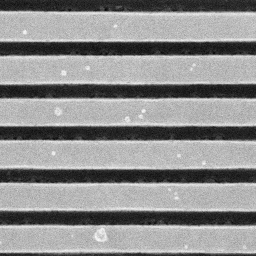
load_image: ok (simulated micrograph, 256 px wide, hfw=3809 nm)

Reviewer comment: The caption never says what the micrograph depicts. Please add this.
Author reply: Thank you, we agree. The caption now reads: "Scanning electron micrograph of lines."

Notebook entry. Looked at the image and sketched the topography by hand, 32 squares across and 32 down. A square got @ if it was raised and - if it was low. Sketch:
--------------------------------
--------------------------------
@@@@@@@@@@@@@@@@@@@@@@@@@@@@@@@@
@@@@@@@@@@@@@@@@@@@@@@@@@@@@@@@@
@@@@@@@@@@@@@@@@@@@@@@@@@@@@@@@@
--------------------------------
--------------------------------
@@@@@@@@@@@@@@@@@@@@@@@@@@@@@@@@
@@@@@@@@@@@@@@@@@@@@@@@@@@@@@@@@
@@@@@@@@@@@@@@@@@@@@@@@@@@@@@@@@
@@@-------------@@--------------
--------------------------------
@@@@@@@@@@@@@@@@@@@@@@@@@@@@@@@@
@@@@@@@@@@@@@@@@@@@@@@@@@@@@@@@@
@@@@@@@@@@@@@@@@@@@@@@@@@@@@@@@@
@@@@@@@@@@@@@@@@@@@@@@@@@@@@@@@@
--------------------------------
--------------------------------
@@@@@@@@@@@@@@@@@@@@@@@@@@@@@@@@
@@@@@@@@@@@@@@@@@@@@@@@@@@@@@@@@
@@@@@@@@@@@@@@@@@@@@@@@@@@@@@@@@
--------------------------------
--------------------------------
@@@@@@@@@@@@@@@@@@@@@@@@@@@@@@@@
@@@@@@@@@@@@@@@@@@@@@@@@@@@@@@@@
@@@@@@@@@@@@@@@@@@@@@@@@@@@@@@@@
--------------------------------
--------------------------------
@@@@@@@@@@@@@@@@@@@@@@@@@@@@@@@@
@@@@@@@@@@@@@@@@@@@@@@@@@@@@@@@@
@@@@@@@@@@@@@@@@@@@@@@@@@@@@@@@@
@@@@@@@@@@@@@@@@@@@@@@@@@@@@@@@@